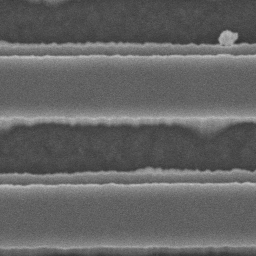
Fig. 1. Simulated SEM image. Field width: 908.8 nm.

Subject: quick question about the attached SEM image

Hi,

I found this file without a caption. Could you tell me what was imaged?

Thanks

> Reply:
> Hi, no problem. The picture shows lines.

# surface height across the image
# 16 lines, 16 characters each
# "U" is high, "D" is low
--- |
DDDDDDDDDDDDDDDD
DDDDDDDDDDDDDDDD
DDDDDDDDDDDDDDDD
UUUUUUUUUUUUUUUU
UUUUUUUUUUUUUUUU
UUUUUUUUUUUUUUUU
UUUUUUUUUUUUUUUU
UUDDDDDDUDDDUUDD
DDDDDDDDDDDDDDDD
DDDDDDDDDDDDDDDD
DDDDDDDDDDDDDDDD
UUUUUUUUUUUUUUUU
UUUUUUUUUUUUUUUU
UUUUUUUUUUUUUUUU
UUUUUUUUUUUUUUUU
UUUUUUUUUUUUUDDD